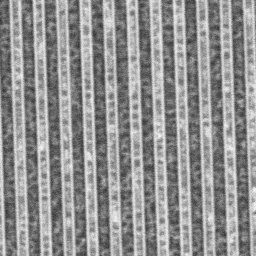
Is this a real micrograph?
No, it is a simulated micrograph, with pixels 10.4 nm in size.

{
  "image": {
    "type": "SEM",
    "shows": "parallel lines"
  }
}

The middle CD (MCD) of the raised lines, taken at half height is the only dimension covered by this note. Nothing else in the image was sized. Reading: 94.4 nm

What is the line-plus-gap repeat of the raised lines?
0.241 um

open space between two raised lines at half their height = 142 nanometers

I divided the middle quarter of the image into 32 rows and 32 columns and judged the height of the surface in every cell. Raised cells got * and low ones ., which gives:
*....**....**....**...**....**..
*....**....**....**...**....**..
*....**....**....**...**....**..
*....**....**....**...**....**..
*....**....**...***...**....**..
*....**....**....**...**....**..
*....**....**....**...**....**..
*....**....**....**...***...**..
*....**....**....**...***...**..
*....**....**....**....**...***.
*....**....**....**....**...***.
*....**....**....**....**...***.
*....**....**....**....**...***.
*....**....**....**....**...***.
*....**....**....**....**...***.
*....**....**....**....**...***.
*....**....**....**....**...***.
*....**....**....**....**...***.
**...**....**....**....**....**.
**...**....**....**....**....**.
**...***...**....**....**....**.
**...***...**....**....**....**.
**...***...**....**....**....**.
**...***...**....**....**....**.
**...***...**....**....**....**.
**...***...**....**....**....**.
**...***...**....**....**....**.
**...***...**....**....**....**.
**...***...**....**....**....**.
**....**...***...**....**....**.
**....**...***...***...**....**.
**....**....**...***...**....**.